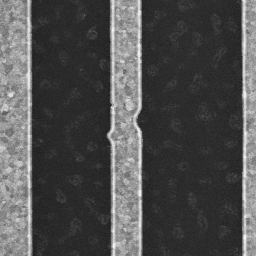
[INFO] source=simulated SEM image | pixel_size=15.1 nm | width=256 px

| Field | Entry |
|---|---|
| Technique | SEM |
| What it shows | one or a few lines or trenches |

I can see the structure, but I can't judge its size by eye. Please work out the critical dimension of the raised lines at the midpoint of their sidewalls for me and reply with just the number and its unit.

388 nanometers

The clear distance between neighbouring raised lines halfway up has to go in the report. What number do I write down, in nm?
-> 1440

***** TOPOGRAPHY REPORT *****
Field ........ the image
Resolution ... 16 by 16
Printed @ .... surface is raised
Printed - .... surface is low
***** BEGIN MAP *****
@@-----@@------@
@@-----@@------@
@@-----@@------@
@@-----@@------@
@@-----@@------@
@@-----@@------@
@@-----@@------@
@@-----@-------@
@@-----@@------@
@@-----@@------@
@@-----@@------@
@@-----@@------@
@@-----@@------@
@@-----@@------@
@@-----@@------@
@@-----@@------@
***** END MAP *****